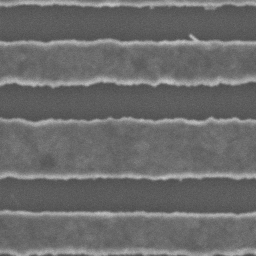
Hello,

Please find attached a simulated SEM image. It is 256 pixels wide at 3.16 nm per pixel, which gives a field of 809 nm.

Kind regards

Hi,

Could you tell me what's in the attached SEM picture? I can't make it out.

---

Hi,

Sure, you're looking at lines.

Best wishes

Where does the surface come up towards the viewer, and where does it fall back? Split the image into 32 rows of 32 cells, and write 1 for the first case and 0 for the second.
11100100111111111111111111110111
00000000000000000000000000000000
00000000000000000000000000000000
00000000000000000000000000000000
00000000000000000000000000000000
11111111111111111111111111111111
11111111111111111111111111111111
11111111111111111111111111111111
11111111111111111111111111111111
11111111111111111111111111111111
10111111111100011011011111100100
00000000000000000000000000000000
00000000000000000000000000000000
00000000000000000000000000000000
00000000000000000000000000000000
11111111111111111111111111111111
11111111111111111111111111111111
11111111111111111111111111111111
11111111111111111111111111111111
11111111111111111111111111111111
11111111111111111111111111111111
11111111111111111111111111111111
00000000000000000000000000000000
00000000000000000000000000000000
00000000000000000000000000000000
00000000000000000000000000000000
11100000000000000000000000000000
11111111111111111111111111111111
11111111111111111111111111111111
11111111111111111111111111111111
11111111111111111111111111111111
11111111111111111111111111111111